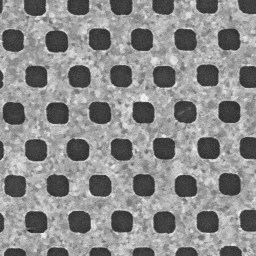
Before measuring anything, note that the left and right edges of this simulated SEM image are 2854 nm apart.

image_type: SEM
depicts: a regular array of holes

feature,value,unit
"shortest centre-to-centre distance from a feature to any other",466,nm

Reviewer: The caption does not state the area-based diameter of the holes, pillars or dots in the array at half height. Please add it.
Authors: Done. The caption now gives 0.271 microns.